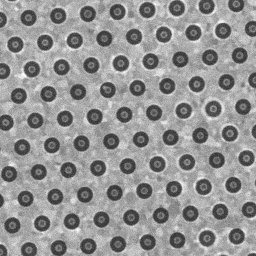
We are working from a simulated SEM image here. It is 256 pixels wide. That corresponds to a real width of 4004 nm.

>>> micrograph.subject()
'an array of small figures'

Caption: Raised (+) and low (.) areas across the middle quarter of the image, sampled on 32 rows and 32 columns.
..+++....+++....++++....++++..++
.++++....+++....+++++.++++++++++
.+++++++++++++++++++++++++++++++
+++++++++++++++++++++++++..+++++
++++++++++..+++++...++++....+++.
++...++++....+++....++++....+++.
++....+++....+++....++++....+++.
++....+++....++++...+++++..+++++
++...+++++..++++++++++++++++++++
+++++++++++++++++++++++++++++..+
+++++++++++++++++++++...++++....
.+++++...++++....++++....+++....
..++++....+++....+++.....+++....
..++++....+++....++++...+++++..+
..++++...+++++..++++++++++++++++
.+++++++++++++++++++++++++++++++
++++++++++++++++++++++++++..++++
+++++++++++..+++++...++++....+++
+++...++++....+++....+++.....+++
++....++++....+++....++++...++++
++....++++....++++..++++++.+++++
+++...++++++++++++++++++++++++++
++++++++++++++++++++++++++++++.+
++++++++++++++++.+++++...++++...
+.+++++...++++....+++.....++....
...++++....+++....+++.....+++...
...+++.....+++....++++...++++...
...++++...+++++..+++++++++++++++
..++++++++++++++++++++++++++++++
++++++++++++++++++++++++++...+++
++++++++++++..++++....++++...+++
++++...++++....+++....+++.....++